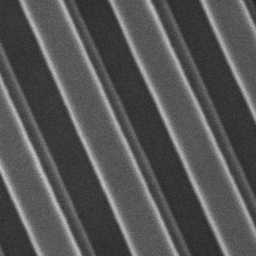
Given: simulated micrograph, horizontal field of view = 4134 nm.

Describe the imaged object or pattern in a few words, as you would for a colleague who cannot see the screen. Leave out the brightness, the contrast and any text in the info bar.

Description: lines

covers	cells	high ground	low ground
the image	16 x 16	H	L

LHHHLLLHHHLLLHHL
LLHHHLLLHHLLLHHH
LLHHHLLLHHHLLLHH
LLLHHLLLHHHLLLHH
LLLHHHLLLHHLLLLH
LLLLHHLLLHHHLLLH
HLLLHHHLLLHHLLLL
HLLLLHHLLLHHHLLL
HHLLLHHHLLLHHLLL
HHLLLHHHLLLHHHLL
HHHLLLHHHLLLHHLL
HHHLLLHHHLLLHHHL
LHHHLLLHHHLLHHHL
LHHHLLLHHHLLLHHH
LLHHLLLLHHLLLHHH
LLHHHLLLHHHLLLHH